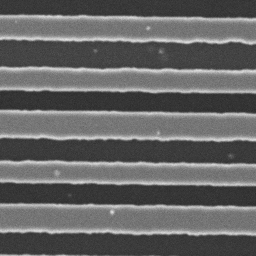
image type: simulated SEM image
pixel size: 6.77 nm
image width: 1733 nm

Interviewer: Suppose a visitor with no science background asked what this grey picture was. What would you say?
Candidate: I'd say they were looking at lines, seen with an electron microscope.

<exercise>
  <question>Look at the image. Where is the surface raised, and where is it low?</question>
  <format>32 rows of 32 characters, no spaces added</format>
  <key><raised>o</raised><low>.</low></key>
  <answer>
................................
................................
oooooooooooooooooooooooooooooooo
oooooooooooooooooooooooooooooooo
oooooooooooooooooooooooooooooooo
...............................o
................................
................................
oooooooo.......o................
oooooooooooooooooooooooooooooooo
oooooooooooooooooooooooooooooooo
..................oo..oooooooooo
................................
................................
oooooooooooooooooooooooooooooooo
oooooooooooooooooooooooooooooooo
oooooooooooooooooooooooooooooooo
........................o.ooo..o
................................
................................
ooooooooooooooooooooooooooo.....
oooooooooooooooooooooooooooooooo
oooooooooooooooooooooooooooooooo
................................
................................
................................
oooooooooooooooooooooooooooooooo
oooooooooooooooooooooooooooooooo
oooooooooooooooooooooooooooooooo
................................
................................
................................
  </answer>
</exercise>